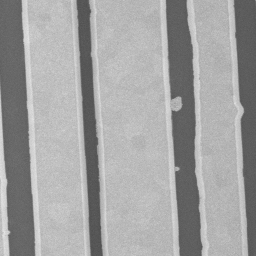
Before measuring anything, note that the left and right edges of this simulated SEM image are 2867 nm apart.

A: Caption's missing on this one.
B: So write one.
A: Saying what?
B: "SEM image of one or a few lines or trenches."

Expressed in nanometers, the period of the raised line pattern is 906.